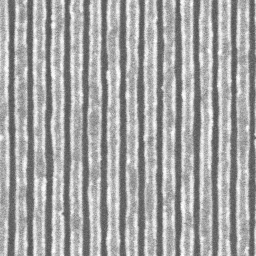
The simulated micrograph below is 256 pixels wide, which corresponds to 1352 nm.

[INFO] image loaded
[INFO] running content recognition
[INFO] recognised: parallel lines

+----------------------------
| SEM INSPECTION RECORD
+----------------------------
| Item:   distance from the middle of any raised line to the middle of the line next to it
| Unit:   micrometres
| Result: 0.0974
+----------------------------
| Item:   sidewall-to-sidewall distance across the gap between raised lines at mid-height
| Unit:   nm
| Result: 38.3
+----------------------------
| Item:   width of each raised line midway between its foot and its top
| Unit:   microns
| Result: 0.0574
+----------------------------